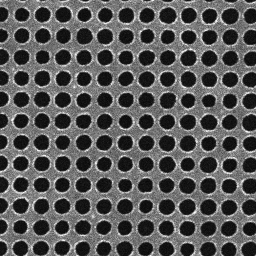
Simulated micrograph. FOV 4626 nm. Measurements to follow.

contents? a regular array of holes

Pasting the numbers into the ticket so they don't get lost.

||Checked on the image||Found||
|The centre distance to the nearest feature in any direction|374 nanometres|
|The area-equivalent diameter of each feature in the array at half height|0.285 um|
